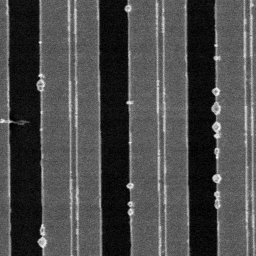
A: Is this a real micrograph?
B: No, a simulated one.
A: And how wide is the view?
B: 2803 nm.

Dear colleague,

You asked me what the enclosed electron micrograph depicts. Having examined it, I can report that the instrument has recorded lines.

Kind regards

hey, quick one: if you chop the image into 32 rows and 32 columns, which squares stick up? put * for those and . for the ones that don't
*....*******....*******....*****
*....*******....*******....*****
*....*******....*******....*****
*....*******....*******....*****
*....*******....*******....*****
*....*******....*******....*****
*....*******....*******....*****
*....*******....*******....*****
*....*******....*******....*****
*....*******....*******....*****
*....*******....*******....*****
*....*******....*******....*****
*....*******....*******....*****
*....*******....*******...******
*....*******....*******....*****
*....*******....*******....*****
*....*******....*******....*****
*....*******....*******....*****
*....*******....*******....*****
*....*******....*******....*****
*....********...*******....*****
*....********...*******....*****
*....********...*******....*****
*....********...*******....*****
*....********...*******....*****
*....********...********...*****
*....********...********...*****
*....********...********...*****
*....********...********...*****
*....********...********...*****
*....********...********...*****
*....********...********...*****